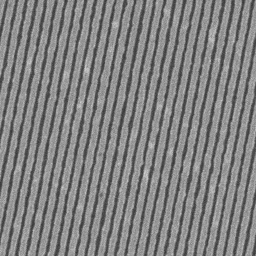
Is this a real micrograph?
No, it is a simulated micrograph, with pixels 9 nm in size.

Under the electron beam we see parallel lines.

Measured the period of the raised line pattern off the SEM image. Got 9.69 px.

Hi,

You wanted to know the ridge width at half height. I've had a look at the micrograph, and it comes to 5.64 px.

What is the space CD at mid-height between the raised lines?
33.1 nm